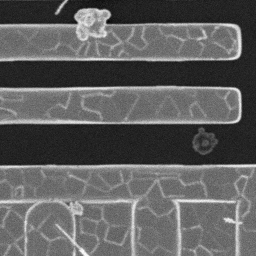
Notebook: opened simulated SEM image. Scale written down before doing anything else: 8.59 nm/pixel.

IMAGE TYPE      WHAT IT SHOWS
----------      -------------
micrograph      wiring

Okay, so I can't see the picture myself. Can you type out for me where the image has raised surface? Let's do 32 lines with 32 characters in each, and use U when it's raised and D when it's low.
DDDDDDDDDDDDDDDDDDDDDDDDDDDDDDDD
DDDDDDDDDDUUUUDDDDDDDDDDDDDDDDDD
DDDDDDDDDDUUUDDDDDDDDDDDDDDDDDDD
UUUUUUUUUUUUUUUUUUUUUUUUUUUUUDDD
UUUUUUUUUUUUUUUUUUUUUUUUUUUUUUDD
UUUUUUUUUUUUUUUUUUUUUUUUUUUUUUDD
UUUUUUUUUUUUUUUUUUUUUUUUUUUUUUDD
DDDDDDDDDDDDDDDUUDDDDDDDUDDDDDDD
DDDDDDDDDDDDDDDDDDDDDDDDDDDDDDDD
DDDDDDDDDDDDDDDDDDDDDDDDDDDDDDDD
DDDDDDDDDDDDDDDDDDDDDDDDDDDDDDDD
UUUUUUUUUUUUUUUUUUUUUUUUUUUUUUDD
UUUUUUUUUUUUUUUUUUUUUUUUUUUUUUDD
UUUUUUUUUUUUUUUUUUUUUUUUUUUUUUDD
UUUUUUUUUUUUUUUUUUUUUUUUUUUUUUDD
DDDDDDDDDDDDDDDDDDDDDDDDDDDDDDDD
DDDDDDDDDDDDDDDDDDDDDDDDDDDDDDDD
DDDDDDDDDDDDDDDDDDDDDDDDDUDDDDDD
DDDDDDDDDDDDDDDDDDDDDDDDDUDDDDDD
DDDDDDDDDDDDDDDDDDDDDDDDDDDDDDDD
DDDDDDDDDDDDDDDDDDDDDDDDDDDDDDDD
UUUUUUUUUUUUUUUUUUUUUUUUUUUUUUUU
UUUUUUUUUUUUUUUUUUUUUUUUUUUUUUUU
UUUUUUUUUUUUUUUUUUUUUUUUUUUUUUUU
UUUUUUUUUUUUUUUUUUUUUUUUUUUUUUUU
DDDDUUUUDUDDDDDDDUUUUUDDDDDDDDUU
DDDDUUUUUUDDDDDDDUUUUUDDDDDDDDUU
DDDUUUUUUDDDDDDDDUUUUUDDDDDDDUUU
DDDUUUUUUDDDDDDDDUUUUUDDDDDDDDUU
DDDUUUUUUDDDDDDDDUUUUUDDDDDDDDUU
DDDUUUUUUUDDDDDDDUUUUUDDDDDDDDUU
DDDUUUUUUDDDDDDDDUUUUUDDDDDDDDUU